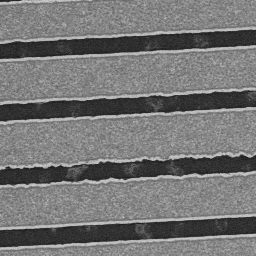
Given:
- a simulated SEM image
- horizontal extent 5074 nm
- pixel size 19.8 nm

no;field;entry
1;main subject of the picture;one or a few lines or trenches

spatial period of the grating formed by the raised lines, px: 62.6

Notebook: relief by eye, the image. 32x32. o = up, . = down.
oooooooooooooooooooooooooooooooo
oooooooooooooooooooooooooooooooo
oooooooooooooooooooooooooooooooo
oooooooooooooooooooooooooooooooo
oooooooooooooo..................
................................
....................oooooooooooo
.ooooooooooooooooooooooooooooooo
oooooooooooooooooooooooooooooooo
oooooooooooooooooooooooooooooooo
oooooooooooooooooooooooooooooooo
oooooooooooooooooooooooo.o......
oooooo..........................
................................
................oooooooooooooooo
oooooooooooooooooooooooooooooooo
oooooooooooooooooooooooooooooooo
oooooooooooooooooooooooooooooooo
oooooooooooooooooooooooooooooooo
ooooooooooooooooooooooooooo.....
oooooooooo......................
................................
................oooooooooooooooo
oooooooooooooooooooooooooooooooo
oooooooooooooooooooooooooooooooo
oooooooooooooooooooooooooooooooo
oooooooooooooooooooooooooooooooo
oooooooooooooooooooo............
oo..............................
.............................o.o
............oooooooooooooooooooo
oooooooooooooooooooooooooooooooo